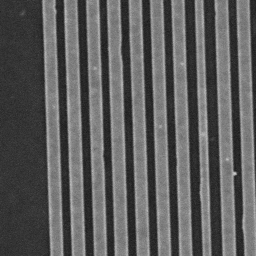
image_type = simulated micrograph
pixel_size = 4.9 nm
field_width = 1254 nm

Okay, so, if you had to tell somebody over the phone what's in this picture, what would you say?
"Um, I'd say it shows parallel lines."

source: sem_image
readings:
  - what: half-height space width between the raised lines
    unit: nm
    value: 42.8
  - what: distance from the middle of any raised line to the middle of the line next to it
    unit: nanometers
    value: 106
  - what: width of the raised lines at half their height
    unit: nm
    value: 61.8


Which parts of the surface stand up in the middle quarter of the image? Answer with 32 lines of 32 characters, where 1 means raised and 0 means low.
01110011100011100111001110001100
01110011100011000111001110001100
01110011100011100111001110001110
01110011100011100111001110001110
01110011100011100111001110001110
01110011100011100111001110001110
01110011100111100111001110001110
01110011100111100111001110001110
01110011100011100111001110001110
01110011100011100111001110001110
01110011100011100111000110001110
01110001100011100111000110001110
01110001100011100111000110001110
01110001110011100111000111001110
01110001110011100111000111001110
01110001110011100111000111001110
01110001110011100111000111001110
01110001110011100111000111001110
01110001110011100111000111001110
01110001110011100111000111001110
01110001110011100111000111001110
01110001110011100011000111001110
01110001110011100011000111001110
01110001110011100011100111001110
01111001110011100011100111001110
01111001110011100011100111001110
01111001110011100011100111001110
01111001110011100011100111001110
01111001110011100011100111001110
00111001110011100011100111001110
00111001110011100011100111001110
00111001110011100011100111001110